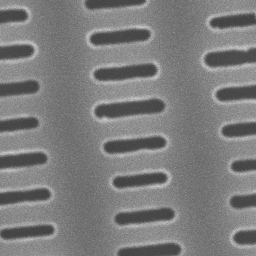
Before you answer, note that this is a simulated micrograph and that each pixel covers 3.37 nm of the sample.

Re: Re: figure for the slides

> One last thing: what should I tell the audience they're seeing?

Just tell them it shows holes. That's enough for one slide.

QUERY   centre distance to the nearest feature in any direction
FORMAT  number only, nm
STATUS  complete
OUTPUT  121